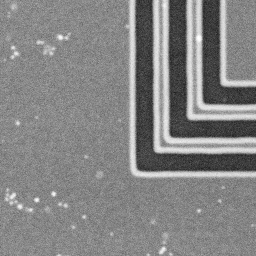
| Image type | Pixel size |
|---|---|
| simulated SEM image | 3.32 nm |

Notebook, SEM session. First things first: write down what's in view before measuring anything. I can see groups of lines, slits or small figures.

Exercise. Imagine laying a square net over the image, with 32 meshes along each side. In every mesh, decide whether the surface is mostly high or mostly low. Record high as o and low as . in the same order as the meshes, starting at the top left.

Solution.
ooooooooooooooooo..oo...o...oooo
ooooooooooooooooo..oo...o...oooo
ooooooooooooooooo..oo...o...oooo
ooooooooooooooooo..oo...o...oooo
ooooooooooooooooo..oo...o...oooo
ooooooooooooooooo..oo...o...oooo
ooooooooooooooooo..oo...o...oooo
ooooooooooooooooo..oo...o...oooo
ooooooooooooooooo..oo...o...oooo
ooooooooooooooooo..oo...o...oooo
ooooooooooooooooo..oo...o...oooo
ooooooooooooooooo..oo...o.......
ooooooooooooooooo..oo...o.......
ooooooooooooooooo..oo...oooooooo
ooooooooooooooooo..oo...oooooooo
ooooooooooooooooo...o...........
ooooooooooooooooo...o...........
ooooooooooooooooo...oo........oo
ooooooooooooooooo...oooooooooooo
ooooooooooooooooo...............
ooooooooooooooooo...............
ooooooooooooooooo...............
oooooooooooooooooooooooooooooooo
oooooooooooooooooooooooooooooooo
oooooooooooooooooooooooooooooooo
oooooooooooooooooooooooooooooooo
oooooooooooooooooooooooooooooooo
oooooooooooooooooooooooooooooooo
oooooooooooooooooooooooooooooooo
oooooooooooooooooooooooooooooooo
oooooooooooooooooooooooooooooooo
oooooooooooooooooooooooooooooooo